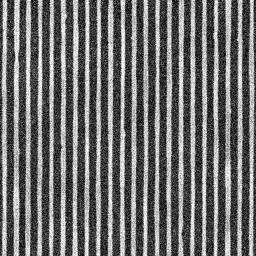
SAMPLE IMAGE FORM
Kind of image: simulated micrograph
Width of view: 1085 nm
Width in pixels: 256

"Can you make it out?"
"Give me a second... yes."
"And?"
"parallel lines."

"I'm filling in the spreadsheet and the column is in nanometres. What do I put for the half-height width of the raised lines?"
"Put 15.4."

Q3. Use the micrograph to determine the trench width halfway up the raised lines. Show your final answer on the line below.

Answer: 33.9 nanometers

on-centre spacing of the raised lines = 49.9 nanometers